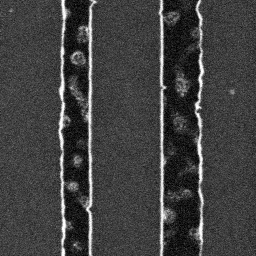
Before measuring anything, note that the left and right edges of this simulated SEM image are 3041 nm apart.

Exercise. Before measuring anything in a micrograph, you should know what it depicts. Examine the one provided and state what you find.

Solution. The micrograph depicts one or a few lines or trenches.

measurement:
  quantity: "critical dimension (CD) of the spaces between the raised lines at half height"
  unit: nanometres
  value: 847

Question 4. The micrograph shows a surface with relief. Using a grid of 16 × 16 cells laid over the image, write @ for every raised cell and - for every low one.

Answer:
----@@----@@----
----@@----@@@---
----@@----@@@---
----@@----@@@---
----@@----@@@---
----@@----@@@---
----@@----@@----
----@@----@@----
----@@----@@@---
----@@----@@@---
----@@----@@@---
----@@----@@@---
----@@----@@@---
----@@----@@@---
----@@----@@@---
----@@----@@@---